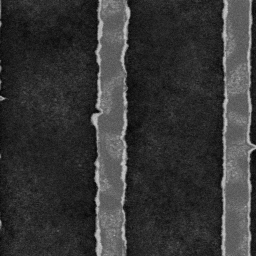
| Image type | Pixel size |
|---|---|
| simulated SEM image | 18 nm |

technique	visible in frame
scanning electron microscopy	one or a few lines or trenches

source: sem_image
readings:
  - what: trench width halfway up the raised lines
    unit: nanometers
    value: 1810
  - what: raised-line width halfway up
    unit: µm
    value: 0.455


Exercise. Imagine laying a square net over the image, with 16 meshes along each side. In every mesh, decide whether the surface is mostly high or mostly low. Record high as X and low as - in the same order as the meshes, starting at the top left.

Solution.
------XX------XX
------XX------XX
------XX------XX
------XX------XX
------XX------XX
------XX------XX
------XX------XX
------XX------XX
------XX------XX
------XX------XX
------XX------XX
------XX------XX
------XX------XX
------XX------XX
------XX------XX
------XX------XX